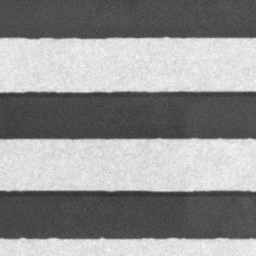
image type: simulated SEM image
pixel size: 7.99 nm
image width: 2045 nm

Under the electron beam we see lines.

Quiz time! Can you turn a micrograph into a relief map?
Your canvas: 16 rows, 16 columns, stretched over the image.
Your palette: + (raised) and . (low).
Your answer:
................
................
++++++++++++++++
++++++++++++++++
++++++++++++++++
++++++++++++++++
................
................
................
++++++++++++++++
++++++++++++++++
++++++++++++++++
................
................
................
++++++++++++++++